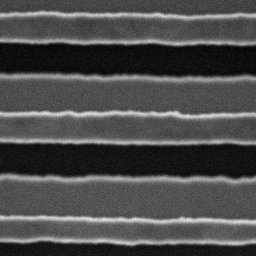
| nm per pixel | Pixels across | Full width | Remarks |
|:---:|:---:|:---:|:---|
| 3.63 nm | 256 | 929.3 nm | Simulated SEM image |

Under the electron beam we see lines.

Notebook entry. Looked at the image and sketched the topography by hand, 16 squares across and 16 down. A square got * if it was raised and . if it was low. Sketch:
****************
****************
****************
................
................
****************
****************
****************
****************
................
................
****************
****************
****************
****************
................